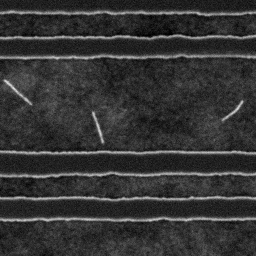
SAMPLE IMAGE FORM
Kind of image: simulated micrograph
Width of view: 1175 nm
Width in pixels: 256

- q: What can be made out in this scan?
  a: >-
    lines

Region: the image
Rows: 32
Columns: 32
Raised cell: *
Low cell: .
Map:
********************************
********************************
................................
................................
.....................**........*
********************************
********************************
................................
................................
................................
................................
................................
................................
................................
................................
................................
................................
................................
................................
********************************
********************************
********************************
................................
................................
................................
********************************
********************************
*******.*.**********.***..***.*.
................................
................................
................................
................................